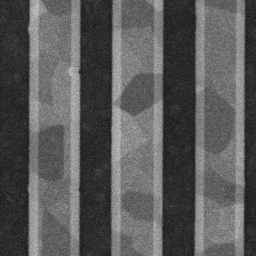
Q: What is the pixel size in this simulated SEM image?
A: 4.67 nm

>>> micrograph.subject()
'one or a few lines or trenches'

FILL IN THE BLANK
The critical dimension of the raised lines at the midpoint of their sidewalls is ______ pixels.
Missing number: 41.7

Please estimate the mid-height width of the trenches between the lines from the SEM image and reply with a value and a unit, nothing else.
191 nanometers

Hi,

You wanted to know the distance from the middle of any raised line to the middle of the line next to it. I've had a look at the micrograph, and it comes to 0.386 µm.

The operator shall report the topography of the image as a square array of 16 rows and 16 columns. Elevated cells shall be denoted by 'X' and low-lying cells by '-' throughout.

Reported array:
--XXX--XXX---XX-
--XXX--XXX---XX-
--XXX--XXX---XX-
--XXX--XXX---XX-
--XXX--XXX---XX-
--XXX--XXX---XX-
--XXX--XXX---XX-
--XXX--XXX---XX-
--XXX--XXX---XX-
--XXX--XXX--XXX-
--XXX--XXX--XXX-
--XXX--XXX--XXX-
--XXX--XXX--XXX-
--XXX--XXX--XXX-
--XXX--XXX--XXX-
--XXX--XXX--XXX-